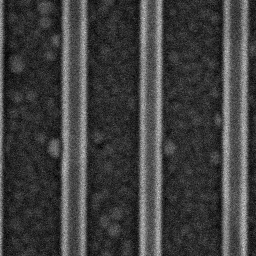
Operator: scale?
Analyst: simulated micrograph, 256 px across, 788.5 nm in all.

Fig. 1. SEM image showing one or a few lines or trenches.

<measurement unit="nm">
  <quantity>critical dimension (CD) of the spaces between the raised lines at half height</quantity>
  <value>201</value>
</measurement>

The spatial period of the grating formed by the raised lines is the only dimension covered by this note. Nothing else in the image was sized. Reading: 248 nanometers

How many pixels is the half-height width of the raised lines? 18.5